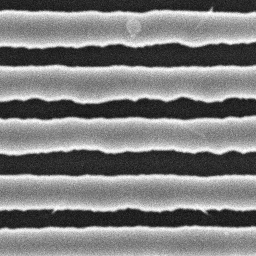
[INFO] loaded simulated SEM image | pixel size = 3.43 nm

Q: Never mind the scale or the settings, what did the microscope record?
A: lines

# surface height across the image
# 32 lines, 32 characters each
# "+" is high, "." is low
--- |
................................
++++++++.++++.++..+++++++++.....
++++++++++++++++++++++++++++++++
++++++++++++++++++++++++++++++++
++++++++++++++++++++++++++++++++
++++++++++++++++++++...+++......
................................
................................
++++++++++++++++++++++++++++++++
++++++++++++++++++++++++++++++++
++++++++++++++++++++++++++++++++
++++++++++++++++++++++++++++++++
+.....+..+++++..+...+....+++....
................................
................................
++++++++++++++++++++++++++++++++
++++++++++++++++++++++++++++++++
++++++++++++++++++++++++++++++++
++++++++++++++++++++++++++++++++
................................
................................
................................
++++++++++++++++++++++++++++++++
++++++++++++++++++++++++++++++++
++++++++++++++++++++++++++++++++
++++++++++++++++++++++++++++++++
................................
................................
......+++..+++++++++++++++++++++
++++++++++++++++++++++++++++++++
++++++++++++++++++++++++++++++++
++++++++++++++++++++++++++++++++